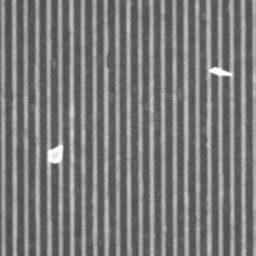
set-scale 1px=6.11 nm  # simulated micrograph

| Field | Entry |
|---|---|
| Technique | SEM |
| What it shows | parallel lines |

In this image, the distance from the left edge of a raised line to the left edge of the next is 0.0699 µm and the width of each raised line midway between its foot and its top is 0.0168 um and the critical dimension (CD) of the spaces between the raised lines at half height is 55.7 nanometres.